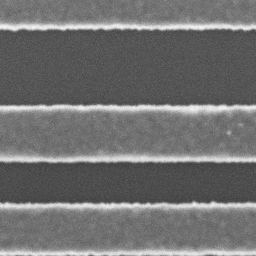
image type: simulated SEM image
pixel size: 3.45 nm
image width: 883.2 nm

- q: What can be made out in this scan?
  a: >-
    lines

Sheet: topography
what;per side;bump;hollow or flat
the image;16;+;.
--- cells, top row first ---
++++++++++++++++
++++++++++++++++
................
................
................
................
................
++++++++++++++++
++++++++++++++++
++++++++++++++++
................
................
................
++++++++++++++++
++++++++++++++++
++++++++++++++++